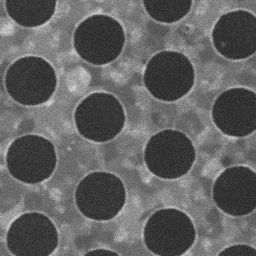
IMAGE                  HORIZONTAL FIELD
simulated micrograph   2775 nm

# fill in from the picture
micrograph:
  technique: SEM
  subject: holes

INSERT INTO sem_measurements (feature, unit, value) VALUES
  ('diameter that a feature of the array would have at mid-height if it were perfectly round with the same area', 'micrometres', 0.557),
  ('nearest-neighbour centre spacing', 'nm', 847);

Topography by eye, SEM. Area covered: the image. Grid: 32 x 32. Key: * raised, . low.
*......***********......********
*......***********......*****..*
**....****.....****...*****.....
*********......********.***.....
*********.......**********......
*********.......***********.....
**********.....*****..*****.....
**....****....*****.....*****.**
*......***********......********
*......***********......********
*......***********......********
*......*****.******.....****....
**....****.....*****..*****.....
*********......************.....
*********.......**********......
*********.......***********.....
**********.....*****...*****....
**....*****...*****.....********
*......***********......********
*......***********......********
*......***********......********
*......*****..*****.....****....
**....****.....************.....
*********.......***********.....
*********.......***********.....
**********......***********.....
****.*****.....****....*****...*
**....******..****......********
*......***********......********
*......***********.......*******
*......***********......********
*......****...*****....*****....